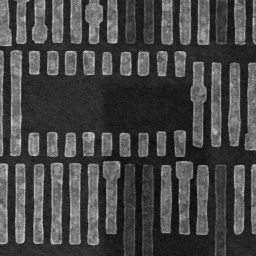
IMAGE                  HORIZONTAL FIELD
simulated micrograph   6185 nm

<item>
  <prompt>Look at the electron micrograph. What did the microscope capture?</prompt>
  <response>wiring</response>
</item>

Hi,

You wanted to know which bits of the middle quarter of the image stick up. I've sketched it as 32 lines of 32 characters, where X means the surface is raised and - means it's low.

XXX--XX---XX--XXX--XX---XX--XX--
XXX--XX---XX--XXX--XX---X---XX--
-X--------X---XX---XX---X---XX--
--------------------------------
--------------------------------
--------------------------------
--------------------------------
--------------------------------
--------------------------------
--------------------------------
--------------------------------
--------------------------------
--------------------------------
--------------------------------
--------------------------------
--------------------------------
--------------------------------
-X---XX---XX--XX-------XX---XX--
-XX--XX---XX--XX---XX--XX---XX--
XXX--XX---XX--XX---XX--XX---XX--
XXX--XX---XX--XX---XX--XX---XX--
XXX--XX---XX--XX---XX--XX---XX--
XXX--XX---XX--XX---XX--XX---XX--
--------------------------------
----------XXXX--------------XXXX
-XXX--XXX-XXXX-XXX--XX---X--XXXX
-XXX--XXX-XXXX-XXX--XX---XX-XXXX
--XX--XXX-XXXX-XXX--XX---XX-XXXX
--XX--XXX-XXXX-XXX--XX---XX--XXX
--XX--XX---XX--XXX--XX---XX--XX-
--XX--XX---XX--XXX--XX---XX--XX-
--XX--XX---XX--XXX--XX--XXX--XX-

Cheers